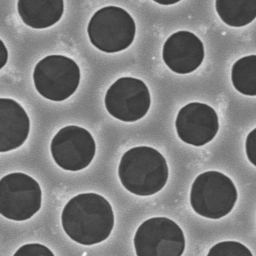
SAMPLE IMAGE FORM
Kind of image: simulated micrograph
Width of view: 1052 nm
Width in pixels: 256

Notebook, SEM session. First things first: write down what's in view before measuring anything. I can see a regular array of holes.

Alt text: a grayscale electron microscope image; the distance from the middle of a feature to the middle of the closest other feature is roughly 296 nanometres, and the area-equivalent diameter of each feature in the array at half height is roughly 192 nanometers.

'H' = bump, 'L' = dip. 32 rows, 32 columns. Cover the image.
HHLLLLLLHHHHHHHHHHHHLLHHHHHLLLLL
HHLLLLLLHHHHLLLLHHHHHHHHHHHLLLLL
HHHLLLLHHHHLLLLLLHHHHHHHHHHHLLLL
HHHHLLHHHHHLLLLLLHHHHHHHHHHHHHHH
HHHHHHHHHHHLLLLLLHHHHLLLLHHHHHHH
HHHHHHHHHHHHLLLLHHHHHLLLLHHHHHHH
LHHHHHHHHHHHHLHHHHHHLLLLLLHHHHHH
LHHHHLLLLHHHHHHHHHHHLLLLLHHHHHLL
HHHHLLLLLLHHHHHHHHHHHLLLLHHHHLLL
HHHHLLLLLLHHHHHHHHHHHHHHHHHHHLLL
HHHHLLLLLLHHHHLLLLHHHHHHHHHHHLLL
HHHHHLLLLHHHHLLLLLLHHHHHHHHHHHLL
LLHHHHLLHHHHHLLLLLLHHHHHHHHHHHHH
LLLHHHHHHHHHHLLLLLLHHHHLLLHHHHHH
LLLHHHHHHHHHHHLLLLHHHHLLLLLHHHHH
LLLLHHHHHHHHHHHHHHHHHHLLLLLHHHHH
LLLLHHHLLLLHHHHHHHHHHHLLLLLHHHHL
LLLHHHHLLLLLHHHHHHHHHHHLLLHHHHHL
LLHHHHLLLLLLHHHHHLLHHHHHHHHHHHHL
HHHHHHHLLLLLHHHLLLLLHHHHHHHHHHHL
HHHHHHHLLLLHHHHLLLLLLHHHHHHHHHHH
HHHHHHHHHHHHHHHLLLLLLHHHHHLHHHHH
LLLLHHHHHHHHHHHLLLLLLHHHLLLLLHHH
LLLLLHHHHHHHHHHHLLLLHHHHLLLLLHHH
LLLLLHHHHHLLLHHHHHHHHHHHLLLLLLHH
LLLLLHHHLLLLLLHHHHHHHHHHLLLLLHHH
LLLLLHHHLLLLLLHHHHHHHHHHHLLLLHHH
HHLHHHHHLLLLLLHHHHLLLHHHHHHHHHHH
HHHHHHHHLLLLLLHHHLLLLLLHHHHHHHHH
HHHHHHHHHLLLLLHHHLLLLLLHHHHHHHHH
HHHHLHHHHHLLHHHHHLLLLLLHHHHLLLHH
HHLLLLHHHHHHHHHHHLLLLLLHHHLLLLLH